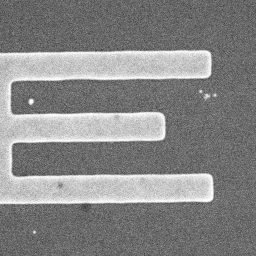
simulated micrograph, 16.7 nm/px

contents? groups of lines, slits or small figures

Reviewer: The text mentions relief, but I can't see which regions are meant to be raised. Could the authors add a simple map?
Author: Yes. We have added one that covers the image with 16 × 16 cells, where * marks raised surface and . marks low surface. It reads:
................
................
................
*************...
*************...
*...............
*...............
**********......
**********......
*...............
*...............
*************...
*************...
................
................
................